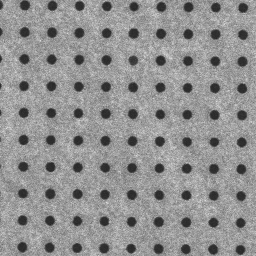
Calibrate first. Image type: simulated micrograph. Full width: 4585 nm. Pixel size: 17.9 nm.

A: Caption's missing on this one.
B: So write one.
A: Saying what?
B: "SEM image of a regular array of holes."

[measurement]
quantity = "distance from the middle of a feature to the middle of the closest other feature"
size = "476 nm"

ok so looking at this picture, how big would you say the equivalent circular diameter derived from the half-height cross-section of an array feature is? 0.183 um